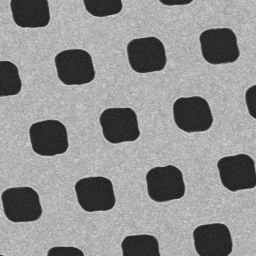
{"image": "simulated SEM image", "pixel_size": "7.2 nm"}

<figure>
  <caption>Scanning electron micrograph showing a regular array of holes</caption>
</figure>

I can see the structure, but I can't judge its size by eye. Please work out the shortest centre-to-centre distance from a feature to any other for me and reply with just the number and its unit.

518 nanometres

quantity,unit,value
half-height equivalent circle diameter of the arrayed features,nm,276